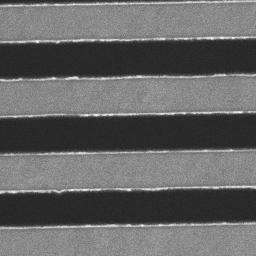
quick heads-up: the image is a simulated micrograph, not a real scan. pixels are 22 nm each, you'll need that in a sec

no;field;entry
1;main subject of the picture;one or a few lines or trenches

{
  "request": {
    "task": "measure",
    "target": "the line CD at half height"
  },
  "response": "850 nm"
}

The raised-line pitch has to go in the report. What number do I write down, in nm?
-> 1640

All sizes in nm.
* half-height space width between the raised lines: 773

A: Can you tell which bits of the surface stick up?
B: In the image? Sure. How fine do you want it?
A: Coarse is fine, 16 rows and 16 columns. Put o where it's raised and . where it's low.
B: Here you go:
................
................
.....ooooooooooo
oooooooooooooooo
oooooooooooooooo
................
................
oooooooooooooooo
oooooooooooooooo
oooooooooo......
................
................
oooooooooooooooo
oooooooooooooooo
................
................